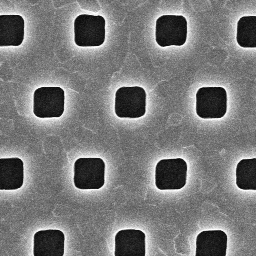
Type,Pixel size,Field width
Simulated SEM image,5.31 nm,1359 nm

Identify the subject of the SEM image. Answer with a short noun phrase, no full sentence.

holes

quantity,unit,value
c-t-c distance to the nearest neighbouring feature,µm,0.433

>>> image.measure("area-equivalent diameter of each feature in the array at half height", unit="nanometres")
180